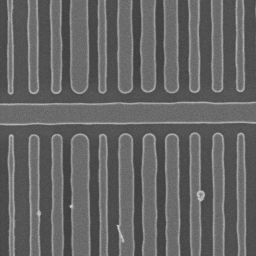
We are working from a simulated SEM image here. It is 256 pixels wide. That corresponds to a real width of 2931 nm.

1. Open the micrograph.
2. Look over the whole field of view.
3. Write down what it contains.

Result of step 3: groups of lines, slits or small figures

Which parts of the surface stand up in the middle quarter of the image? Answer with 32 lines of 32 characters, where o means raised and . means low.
..oooo...o....ooo..oooo..ooo...o
..oooo...o....ooo..oooo..ooo...o
..oooo...o....ooo..oooo..ooo...o
..oooo...o....ooo..oooo..ooo...o
..oooo...o....ooo..oooo..oooo..o
..oooo...o....ooo..oooo..oooo..o
..ooo....o....ooo...oo...ooo....
................................
................................
................................
oooooooooooooooooooooooooooooooo
oooooooooooooooooooooooooooooooo
oooooooooooooooooooooooooooooooo
oooooooooooooooooooooooooooooooo
oooooooooooooooooooooooooooooooo
................................
................................
................................
..oooo...o....ooo...ooo..ooo....
..oooo...oo...ooo...ooo..oooo...
..oooo...oo...ooo...ooo..oooo...
..oooo...oo...ooo...ooo..oooo...
..oooo...oo...ooo...ooo..oooo...
..oooo...oo...ooo...ooo..oooo...
..oooo...oo...ooo...ooo..oooo...
..oooo...oo...ooo..oooo..oooo...
..oooo...oo...ooo..oooo..oooo...
..oooo...oo...ooo..oooo..oooo...
..oooo...oo...ooo..oooo...ooo...
..oooo...oo...ooo...ooo...ooo...
..oooo...oo...ooo...ooo...ooo...
..oooo...oo...ooo...ooo...ooo...